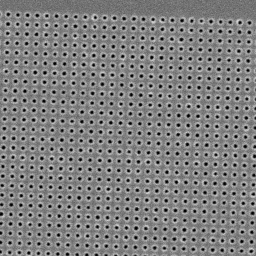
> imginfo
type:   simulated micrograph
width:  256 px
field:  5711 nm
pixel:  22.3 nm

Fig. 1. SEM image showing a regular array of holes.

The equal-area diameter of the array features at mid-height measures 4.07 px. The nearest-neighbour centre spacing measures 9.34 px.